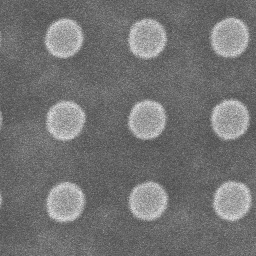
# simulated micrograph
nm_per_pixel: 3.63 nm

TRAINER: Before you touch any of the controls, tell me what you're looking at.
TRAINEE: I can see a regular array of raised bodies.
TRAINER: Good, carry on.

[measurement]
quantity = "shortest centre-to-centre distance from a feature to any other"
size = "295 nanometers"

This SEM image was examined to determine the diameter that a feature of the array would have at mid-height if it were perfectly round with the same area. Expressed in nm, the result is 131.